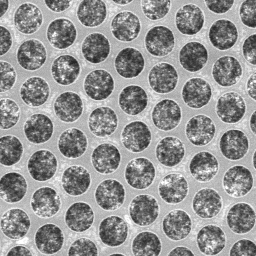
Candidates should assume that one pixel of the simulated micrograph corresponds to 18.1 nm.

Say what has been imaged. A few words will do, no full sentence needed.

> a regular array of holes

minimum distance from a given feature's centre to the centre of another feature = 663 nm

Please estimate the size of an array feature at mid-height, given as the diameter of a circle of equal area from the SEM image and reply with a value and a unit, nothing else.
30 pixels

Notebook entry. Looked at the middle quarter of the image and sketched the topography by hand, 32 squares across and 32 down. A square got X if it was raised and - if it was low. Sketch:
----XXXXXXXXX-------XXX----XXX--
----XXXX--XXX-------XX------XXX-
----XX------XX-----XX-------XXXX
---XX-------XXXX-XXXX-------XXXX
--XXX-------XXXXXXXXX-------XXX-
XXXXX--------XXX---XXX------XX--
XXXXX-------XXX-----XX-----XXX--
---XXX------XX-------XXXXXXXX---
----XXX----XXX-------XXXXXXXXX--
-----XXXXXXXXX-------XXX----XX--
-----XXXXXXXXX-------XX------XX-
-----XX-----XXX-----XX-------XXX
----XXX------XXX---XXX-------XXX
----XX-------XXXXXXXXX-------XXX
--XXXX--------XXX---XX-------XX-
XXXXXX-------XX------XX-----XXX-
X---XXX------XX------XXXX--XXX--
-----XX-----XX--------XXXXXXXXX-
------XXXXXXXX--------XXX---XXX-
------XXXXXXXXX-------XX-----XXX
------XXX----XX------XX-------XX
-----XXX------XX----XXX-------XX
-----XX-------XXXXXXXXX-------XX
X--XXXX-------XXXX--XXX-------XX
XXXXXXX-------XX------XX-----XXX
XX--XXX-------XX------XXX---XXX-
------XX-----XX--------XXXXXXXX-
------XXXX-XXXX--------XXXX--XXX
-------XXXXXXXX--------XX-----XX
-------XX-----XX------XX-------X
------XX-------XX----XXX-------X
------XX-------XXXXXXXXX-------X